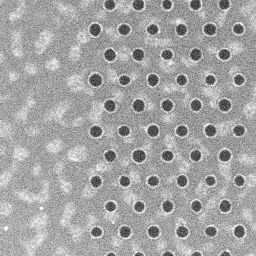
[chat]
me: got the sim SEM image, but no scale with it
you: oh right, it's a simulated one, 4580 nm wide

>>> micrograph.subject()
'a regular array of raised bodies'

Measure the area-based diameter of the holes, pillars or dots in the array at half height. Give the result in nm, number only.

236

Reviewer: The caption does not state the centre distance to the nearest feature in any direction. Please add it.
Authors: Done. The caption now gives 509 nanometres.